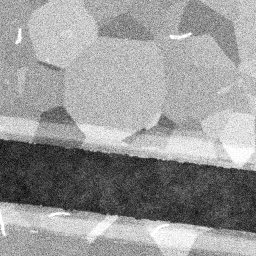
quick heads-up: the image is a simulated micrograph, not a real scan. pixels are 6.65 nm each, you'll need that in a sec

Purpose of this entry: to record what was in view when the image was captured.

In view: one or a few lines or trenches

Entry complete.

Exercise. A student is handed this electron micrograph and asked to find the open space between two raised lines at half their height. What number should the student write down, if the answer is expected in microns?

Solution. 0.597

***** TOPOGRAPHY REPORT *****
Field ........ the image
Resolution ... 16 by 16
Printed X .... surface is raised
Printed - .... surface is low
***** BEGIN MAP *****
XXXXXXXXXXXXXXXX
XXXXXXXXXXXXXXXX
XXXXXXXXXXXXXXXX
XXXXXXXXXXXXXXXX
XXXXXXXXXXXXXXXX
XXXXXXXXXXXXXXXX
XXXXXXXXXXXXXXXX
XXXXXXXXXXXXXXXX
------XXXXXXXXXX
--------------XX
----------------
----------------
----------------
X---------------
XXXXXXXX--------
XXXXXXXXXXXXXXXX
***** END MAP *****